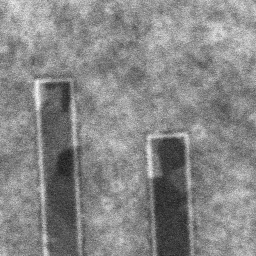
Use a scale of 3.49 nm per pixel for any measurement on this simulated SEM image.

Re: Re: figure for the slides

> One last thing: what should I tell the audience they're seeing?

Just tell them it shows one or a few lines or trenches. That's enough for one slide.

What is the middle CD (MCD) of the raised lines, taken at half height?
0.125 micrometres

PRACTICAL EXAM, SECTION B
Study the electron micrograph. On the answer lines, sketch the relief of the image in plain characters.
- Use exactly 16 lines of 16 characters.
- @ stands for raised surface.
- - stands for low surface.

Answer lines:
----------------
----------------
----------------
----------------
----------------
--@@@-----------
--@@@-----------
--@@@-----------
--@@@-----@-----
--@@@----@@@----
---@@----@@@----
---@@----@@@----
---@@----@@@----
---@@-----@@----
---@@-----@@----
---@@-----@@----